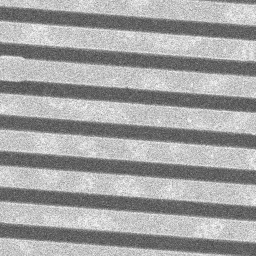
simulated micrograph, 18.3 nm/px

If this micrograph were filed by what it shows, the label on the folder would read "parallel lines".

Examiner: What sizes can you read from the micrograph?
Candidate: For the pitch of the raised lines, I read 0.658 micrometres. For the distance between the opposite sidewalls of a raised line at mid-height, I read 394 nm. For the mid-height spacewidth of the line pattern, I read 269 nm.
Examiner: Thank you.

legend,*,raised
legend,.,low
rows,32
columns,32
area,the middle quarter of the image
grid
***********.....................
************************.*......
********************************
********************************
********************************
........************************
.....................***********
................................
................................
*************...................
**************************......
********************************
********************************
********************************
..........**********************
.......................*********
................................
................................
***********.....................
************************........
********************************
********************************
********************************
........************************
.....................***********
................................
................................
**********......................
***********************.*.......
********************************
********************************
********************************